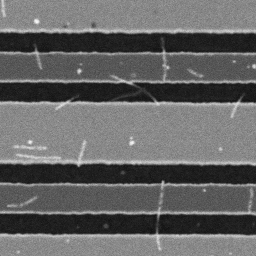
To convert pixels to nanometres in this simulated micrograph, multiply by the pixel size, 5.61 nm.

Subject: lines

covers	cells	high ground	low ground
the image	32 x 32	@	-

@@@@@@@@@@@@@@@@@@@@@@@@@@@@@@@@
@@@@@@@@@@@@@@@@@@@@@@@@@@@@@@@@
@@@@@@@@@@@@@@@@@@@@@@@@@@@@@@@@
@@@@@@@@@@@@@@@@@@@@@@@@@@@@@@@@
--------------------------------
--------------------------------
----@---------------------------
@@@@@@@@@@@@@@@@@@@@@@@@@@@@@@@@
@@@@@@@@@@@@@@@@@@@@@@@@@@@@@@@@
@@@@@@@@@@@@@@@@@@@@@@@@@@@@@@@@
----------------@---------------
--------------------------------
--------------------------------
@@@@@@@@@@@@@@@@@@@@@@@@@@@@@@@@
@@@@@@@@@@@@@@@@@@@@@@@@@@@@@@@@
@@@@@@@@@@@@@@@@@@@@@@@@@@@@@@@@
@@@@@@@@@@@@@@@@@@@@@@@@@@@@@@@@
@@@@@@@@@@@@@@@@@@@@@@@@@@@@@@@@
@@@@@@@@@@@@@@@@@@@@@@@@@@@@@@@@
@@@@@@@@@@@@@@@@@@@@@@@@@@@@@@@@
--@@--@-@@@--@@@@@@@@@@@@@@@@@@@
--------------------------------
--------------------------------
@@@@@@@@@@@@@@@@@@@@@@@@@@@@@@@@
@@@@@@@@@@@@@@@@@@@@@@@@@@@@@@@@
@@@@@@@@@@@@@@@@@@@@@@@@@@@@@@@@
@@@@@@@@@@@@@@@@@@@@@@@@@@@@@@@@
--------------------------------
--------------------------------
@@@@@@@@@@@@@@@@@@@@@@@@@@@@@@@@
@@@@@@@@@@@@@@@@@@@@@@@@@@@@@@@@
@@@@@@@@@@@@@@@@@@@@@@@@@@@@@@@@